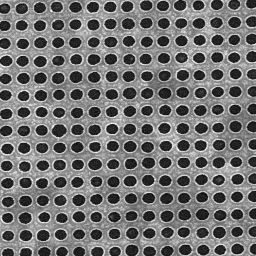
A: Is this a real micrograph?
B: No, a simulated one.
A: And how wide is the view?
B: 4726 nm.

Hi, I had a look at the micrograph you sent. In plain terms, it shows a regular array of holes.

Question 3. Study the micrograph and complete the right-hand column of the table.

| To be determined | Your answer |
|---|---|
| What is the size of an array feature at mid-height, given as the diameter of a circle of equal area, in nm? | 223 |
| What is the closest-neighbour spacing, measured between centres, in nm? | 314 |